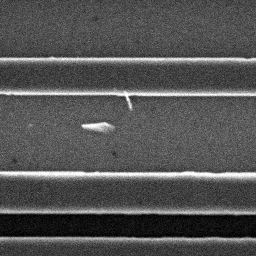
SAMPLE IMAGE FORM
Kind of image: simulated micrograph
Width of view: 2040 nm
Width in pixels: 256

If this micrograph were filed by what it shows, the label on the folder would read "lines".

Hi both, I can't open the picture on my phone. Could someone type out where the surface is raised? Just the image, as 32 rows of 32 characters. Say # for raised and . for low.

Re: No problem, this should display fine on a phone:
................................
................................
................................
................................
................................
................................
................................
################################
################################
################################
################################
################################
................................
................................
................................
................................
................................
................................
................................
................................
................................
................................
################################
################################
################################
################################
################################
................................
................................
................................
################################
################################